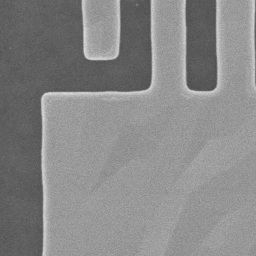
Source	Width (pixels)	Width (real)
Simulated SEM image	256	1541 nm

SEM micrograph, wiring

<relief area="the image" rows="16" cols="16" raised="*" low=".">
.....**..***..**
.....**..***..**
.....**..***..**
.....**...**..**
..........**..**
.........***.***
...*************
...*************
...*************
...*************
...*************
...*************
...*************
...*************
...*************
...*************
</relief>